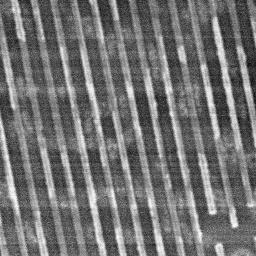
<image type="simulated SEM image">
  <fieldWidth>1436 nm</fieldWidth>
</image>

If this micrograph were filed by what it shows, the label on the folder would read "parallel lines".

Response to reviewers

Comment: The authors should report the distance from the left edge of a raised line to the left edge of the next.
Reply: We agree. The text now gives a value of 108 nm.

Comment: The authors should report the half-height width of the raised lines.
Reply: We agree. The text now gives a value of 0.0303 um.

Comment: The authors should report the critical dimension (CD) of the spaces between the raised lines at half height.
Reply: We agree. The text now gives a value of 0.0813 micrometres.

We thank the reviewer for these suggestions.